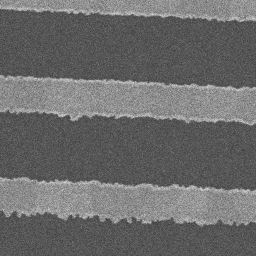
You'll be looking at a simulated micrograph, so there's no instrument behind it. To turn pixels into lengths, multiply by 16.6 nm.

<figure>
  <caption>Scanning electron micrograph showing one or a few lines or trenches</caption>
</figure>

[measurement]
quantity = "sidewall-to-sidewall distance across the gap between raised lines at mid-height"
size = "1140 nm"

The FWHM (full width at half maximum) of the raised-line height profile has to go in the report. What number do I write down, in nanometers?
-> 555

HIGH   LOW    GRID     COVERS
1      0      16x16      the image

1111111111111111
0000000000000000
0000000000000000
0000000000000000
0000000000000000
1111111111111100
1111111111111111
0000000000001111
0000000000000000
0000000000000000
0000000000000000
1111111000000000
1111111111111111
0000001111111111
0000000000000000
0000000000000000